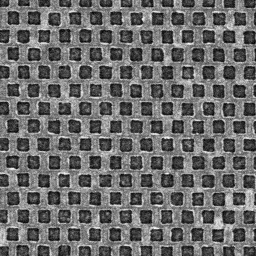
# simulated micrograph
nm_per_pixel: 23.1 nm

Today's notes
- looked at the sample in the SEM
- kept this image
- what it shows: a regular array of holes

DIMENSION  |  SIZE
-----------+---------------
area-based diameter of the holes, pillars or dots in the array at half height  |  14.9 pixels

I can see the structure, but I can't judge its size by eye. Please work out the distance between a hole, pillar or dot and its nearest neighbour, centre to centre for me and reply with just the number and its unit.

466 nm